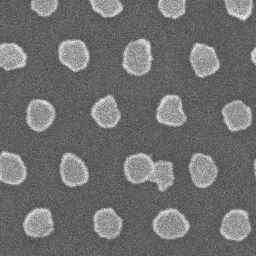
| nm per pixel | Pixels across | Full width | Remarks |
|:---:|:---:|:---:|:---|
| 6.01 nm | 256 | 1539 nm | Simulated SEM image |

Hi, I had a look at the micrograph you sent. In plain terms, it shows a regular array of raised bodies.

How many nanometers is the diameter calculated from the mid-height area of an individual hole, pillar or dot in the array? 169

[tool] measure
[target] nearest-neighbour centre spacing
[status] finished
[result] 0.379 micrometres